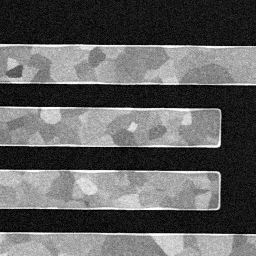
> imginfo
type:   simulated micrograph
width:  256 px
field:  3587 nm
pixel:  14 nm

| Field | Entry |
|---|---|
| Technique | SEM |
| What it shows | groups of lines, slits or small figures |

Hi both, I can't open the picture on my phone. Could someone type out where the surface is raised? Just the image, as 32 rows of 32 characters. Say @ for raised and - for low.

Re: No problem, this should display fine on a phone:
--------------------------------
--------------------------------
--------------------------------
--------------------------------
--------------------------------
--------------------------------
@@@@@@@@@@@@@@@@@@@@@@@@@@@@@@@@
@@@@@@@@@@@@@@@@@@@@@@@@@@@@@@@@
@@@@@@@@@@@@@@@@@@@@@@@@@@@@@@@@
@@@@@@@@@@@@@@@@@@@@@@@@@@@@@@@@
--------------------------@@----
--------------------------------
--------------------------------
@@@@@@@@@@@@--------------------
@@@@@@@@@@@@@@@@@@@@@@@@@@@@----
@@@@@@@@@@@@@@@@@@@@@@@@@@@@----
@@@@@@@@@@@@@@@@@@@@@@@@@@@@----
@@@@@@@@@@@@@@@@@@@@@@@@@@@-----
--------------------------------
--------------------------------
--------------------------------
@@@@@@@@@@@-@@@@@@@@@-----------
@@@@@@@@@@@@@@@@@@@@@@@@@@@-----
@@@@@@@@@@@@@@@@@@@@@@@@@@@-----
@@@@@@@@@@@@@@@@@@@@@@@@@@@-----
@@@@@@@@@@@@@@@@@@@@@@@@@@@-----
--------------------------------
--------------------------------
--------------------------------
@@@@@@@@@@@@@@@@@@@@@@@@@@@@@@@@
@@@@@@@@@@@@@@@@@@@@@@@@@@@@@@@@
@@@@@@@@@@@@@@@@@@@@@@@@@@@@@@@@